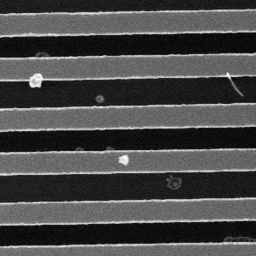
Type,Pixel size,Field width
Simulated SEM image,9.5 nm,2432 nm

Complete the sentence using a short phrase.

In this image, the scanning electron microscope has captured lines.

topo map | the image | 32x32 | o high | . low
................................
............oooooooooooooooooooo
oooooooooooooooooooooooooooooooo
oooooooooooooooooooooooooooooooo
oooooooo........................
................................
................................
oooooooooooooooooooooooooooooooo
oooooooooooooooooooooooooooooooo
oooooooooooooooooooooooooooooooo
....o...........................
................................
................................
........oooooooooooooooooooooooo
oooooooooooooooooooooooooooooooo
oooooooooooooooooooooooooooooooo
................................
................................
................................
oooooooooooooooooooooooooooooooo
oooooooooooooooooooooooooooooooo
ooooooooooooooooooooo...........
................................
................................
................................
oooooooooooooooooooooooooooooooo
oooooooooooooooooooooooooooooooo
oooooooooooooooooooooooooooooooo
................................
................................
....................oooooooooooo
oooooooooooooooooooooooooooooooo